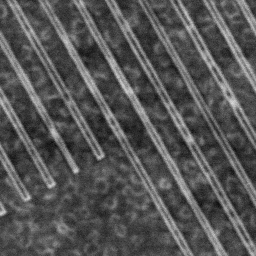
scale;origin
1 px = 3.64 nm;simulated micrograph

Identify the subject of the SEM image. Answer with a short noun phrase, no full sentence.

parallel lines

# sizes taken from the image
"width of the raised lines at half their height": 24.1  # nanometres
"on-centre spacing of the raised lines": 28.6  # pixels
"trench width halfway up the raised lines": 79.8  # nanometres